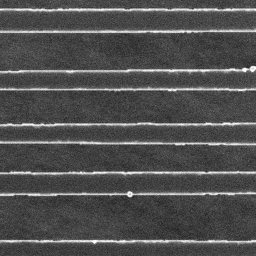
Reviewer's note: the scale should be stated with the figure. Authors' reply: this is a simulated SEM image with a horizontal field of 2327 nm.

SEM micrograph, lines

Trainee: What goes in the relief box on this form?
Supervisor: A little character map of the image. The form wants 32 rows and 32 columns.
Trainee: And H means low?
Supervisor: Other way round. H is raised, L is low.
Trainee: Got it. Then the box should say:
LLLLLLLLLLLLLLLLLLLLLLLLLLLLLLLL
HHHHHHHHHHHHHHHHHHHHHHHHHHHHHHHH
HHHHHHHHHHHHHHHHHHHHHHHHHHHHHHHH
HHHHHHHHHHHHHHHHHHHHHHHHHHHHHHHH
LLLLLLLLLLLLLLLLLLLLLLLLLLLLLLLL
LLLLLLLLLLLLLLLLLLLLLLLLLLLLLLLL
LLLLLLLLLLLLLLLLLLLLLLLLLLLLLLLL
LLLLLLLLLLLLLLLLLLLLLLLLLLLLLLLL
LLLLLLLLLLLLLLLLLLLLLLLLLLLLLLLH
HHHHHHHHHHHHHHHHHHHHHHHHHHHHHHHH
HHHHHHHHHHHHHHHHHHHHHHHHHHHHHHHH
LLLLLLLLLLLLLLLLLLLLLLLLLLLLLLLL
LLLLLLLLLLLLLLLLLLLLLLLLLLLLLLLL
LLLLLLLLLLLLLLLLLLLLLLLLLLLLLLLL
LLLLLLLLLLLLLLLLLLLLLLLLLLLLLLLL
LLLLLLLLLLLLLLLLLHHLLLLLLLLLLHHH
HHHHHHHHHHHHHHHHHHHHHHHHHHHHHHHH
HHHHHHHHHHHHHHHHHHHHHHHHHHHHHHHH
LLLLLLLLLLLLLLLLLLLLLLLLLLLLLLLL
LLLLLLLLLLLLLLLLLLLLLLLLLLLLLLLL
LLLLLLLLLLLLLLLLLLLLLLLLLLLLLLLL
LLLLLLLLLLLLLLLLLLLLLLLLLLLLLLLL
HHHHHHHHHHHHHHHHHHHHHHHHHHHHHHHH
HHHHHHHHHHHHHHHHHHHHHHHHHHHHHHHH
LLLLLLLLLLLLLLLLLLLLLLLLLLLLLLLL
LLLLLLLLLLLLLLLLLLLLLLLLLLLLLLLL
LLLLLLLLLLLLLLLLLLLLLLLLLLLLLLLL
LLLLLLLLLLLLLLLLLLLLLLLLLLLLLLLL
LLLLLLLLLLLLLLLLLLLLLLLLLLLLLLLL
LLLLLLLLLLLLLLLLLLLLLLLLLLLLLLLL
HHHHHHHHHHHHHHHHHHHHHHHHHHHHHHHH
HHHHHHHHHHHHHHHHHHHHHHHHHHHHHHHH